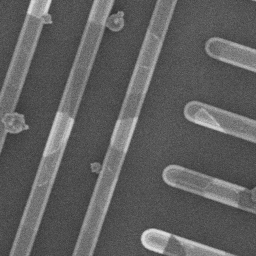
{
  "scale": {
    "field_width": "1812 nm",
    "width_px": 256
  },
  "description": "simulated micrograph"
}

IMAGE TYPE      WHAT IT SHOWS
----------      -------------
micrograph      groups of lines, slits or small figures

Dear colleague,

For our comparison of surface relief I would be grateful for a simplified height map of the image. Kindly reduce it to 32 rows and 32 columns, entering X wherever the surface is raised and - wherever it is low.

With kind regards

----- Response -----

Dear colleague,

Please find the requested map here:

----XX------XX------XX----------
----XX-----XXX-----XX-----------
---XXX-----XXXX----XX-----------
---XX------XX-X----XX-----------
---XX-----XXX-----XXX-----------
--XX------XX------XX------XXX---
--XX------XX------XX------XXXXXX
--XX------XX-----XX---------XXXX
-XX------XX------XX------------X
-XX------XX------XX-------------
-XX-----XXX-----XX--------------
XX------XX------XX--------------
XX------XX------XX--------------
XX------XX-----XX------XXXX-----
XXX----XX------XX------XXXXXXX--
XXX----XX------XX--------XXXXXXX
XX----XXX-----XX------------XXXX
------XX------XX---------------X
------XX------XX----------------
------XX-----XX-----------------
-----XX------XX-----------------
-----XX------XX------XXX--------
----XXX-----XX-------XXXXXX-----
----XX------XX---------XXXXXXX--
----XX------XX------------XXXXXX
----XX-----XX----------------XXX
---XX------XX-------------------
---XX------XX-------------------
--XXX-----XX--------------------
--XX------XX------XXXX----------
--XX------XX------XXXXXXX-------
-XXX-----XX---------XXXXXXXX----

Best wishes